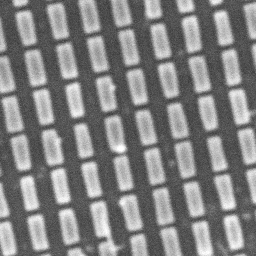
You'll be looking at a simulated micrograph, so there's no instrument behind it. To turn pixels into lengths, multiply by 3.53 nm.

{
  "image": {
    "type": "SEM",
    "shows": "groups of lines, slits or small figures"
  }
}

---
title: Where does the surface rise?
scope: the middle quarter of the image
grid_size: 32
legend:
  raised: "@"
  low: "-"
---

@@@----@@@@-------------@@@-----
@@@-----@@--------@-----@@@@----
@@@-------------@@@@----@@@@----
---------@@-----@@@@----@@@@----
--------@@@@----@@@@----@@@@----
-@@------@@@-----@@@-----@@@----
-@@@-----@@@-----@@@-----@@@----
-@@@-----@@@-----@@@-----@@@----
-@@@-----@@@@----@@@------------
--@@-----@@@@-----@@------------
--@@-----@@@@-------------@@@---
--@@@-----@---------------@@@@--
--@@@-------------@@@-----@@@@--
-----------@@@----@@@@----@@@@--
-----------@@@----@@@@-----@@@--
---@@------@@@-----@@@-----@@@@-
---@@@-----@@@@----@@@-----@@@@-
---@@@-----@@@@----@@@-----@@@@-
---@@@-----@@@@----@@@@---------
----@@@----@@@@-----@@@-------@-
----@@@-----@@@-------------@@@@
----@@@-----@@@------@@-----@@@@
----@@@-------------@@@@----@@@@
-------------@@@-----@@@----@@@@
-------------@@@-----@@@-----@@@
-----@@@-----@@@-----@@@-----@@@
-----@@@-----@@@-----@@@@----@@@
-----@@@-----@@@@----@@@@----@@@
-----@@@-----@@@@----@@@@-------
------@@@-----@@@-----@@@-------
@-----@@@-----@@@-------------@@
@-----@@@---------------@@----@@